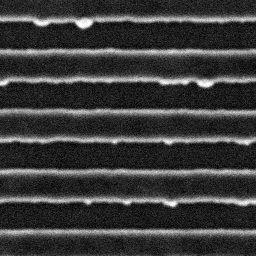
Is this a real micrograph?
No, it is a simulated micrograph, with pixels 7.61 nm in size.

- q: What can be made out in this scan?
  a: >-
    lines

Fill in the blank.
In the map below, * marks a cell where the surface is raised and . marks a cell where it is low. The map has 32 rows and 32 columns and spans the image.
********************************
********************************
********************************
................................
................................
................................
********************************
********************************
********************************
********************************
*........................**.....
................................
................................
................................
********************************
********************************
********************************
********************************
................................
................................
................................
********************************
********************************
********************************
********************************
.....................*..........
................................
................................
................................
********************************
********************************
********************************